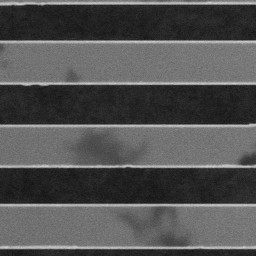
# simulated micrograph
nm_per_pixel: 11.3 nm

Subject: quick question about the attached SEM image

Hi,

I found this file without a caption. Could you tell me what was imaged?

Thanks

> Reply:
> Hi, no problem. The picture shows lines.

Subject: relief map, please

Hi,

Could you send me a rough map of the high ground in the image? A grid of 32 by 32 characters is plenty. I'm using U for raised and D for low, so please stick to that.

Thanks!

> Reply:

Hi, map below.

DDDDDDDDDDDDDDDDDDDDDDDDDDDDDDDD
DDDDDDDDDDDDDDDDDDDDDDDDDDDDDDDD
DDDDDDDDDDDDDDDDDDDDDDDDDDDDDDDD
DDDDDDDDDDDDDDDDDDDDDDDDDDDDDDDD
DDDDDDDDDDDDDDDDDDDDDDDDDDDDDDDD
UUUUUUUUUUUUUUUUUUUUUUUUUUUUUUUU
UUUUUUUUUUUUUUUUUUUUUUUUUUUUUUUU
UUUUUUUUUUUUUUUUUUUUUUUUUUUUUUUU
UUUUUUUUUUUUUUUUUUUUUUUUUUUUUUUU
UUUUUUUUUUUUUUUUUUUUUUUUUUUUUUUU
UUUUUUUUUUUUUUUUUUUUUUUUUUUUUUUU
DDDDDDDDDDDDDDDDDDDDDDDDDDDDDDDD
DDDDDDDDDDDDDDDDDDDDDDDDDDDDDDDD
DDDDDDDDDDDDDDDDDDDDDDDDDDDDDDDD
DDDDDDDDDDDDDDDDDDDDDDDDDDDDDDDD
DDDDDDDDDDDDDDDDDDDDDDDDDDDDDDDD
UUUUUUUUUUUUUUUUUUUUUUUUUUUUUUUU
UUUUUUUUUUUUUUUUUUUUUUUUUUUUUUUU
UUUUUUUUUUUUUUUUUUUUUUUUUUUUUUUU
UUUUUUUUUUUUUUUUUUUUUUUUUUUUUUUU
UUUUUUUUUUUUUUUUUUUUUUUUUUUUUUUU
DDDDDDDDDDDDDDDDDDDDDDDDDDDDDDDD
DDDDDDDDDDDDDDDDDDDDDDDDDDDDDDDD
DDDDDDDDDDDDDDDDDDDDDDDDDDDDDDDD
DDDDDDDDDDDDDDDDDDDDDDDDDDDDDDDD
DDDDDDDDDDDDDDDDDDDDDDDDDDDDDDDD
UUUUUUUUUUUUUUUUUUUUUUUUUUUUUUUU
UUUUUUUUUUUUUUUUUUUUUUUUUUUUUUUU
UUUUUUUUUUUUUUUUUUUUUUUUUUUUUUUU
UUUUUUUUUUUUUUUUUUUUUUUUUUUUUUUU
UUUUUUUUUUUUUUUUUUUUUUUUUUUUUUUU
DDDDDDDDDDDDDDDDDDDDDDDDDDDDDDDD